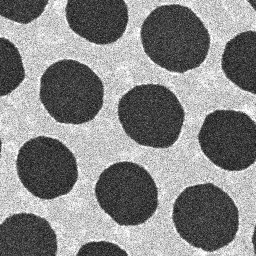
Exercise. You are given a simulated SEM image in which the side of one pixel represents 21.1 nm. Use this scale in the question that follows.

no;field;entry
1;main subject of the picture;holes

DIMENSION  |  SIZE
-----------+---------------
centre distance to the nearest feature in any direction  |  80.9 px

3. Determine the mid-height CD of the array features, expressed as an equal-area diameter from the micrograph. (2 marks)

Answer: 1.39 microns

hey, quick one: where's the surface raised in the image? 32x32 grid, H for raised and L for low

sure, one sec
LLLLLLHHLLLLLLLLHHHHHHHHHHHHHHHL
LLLLLHHHLLLLLLLLHHHLLLLLHHHHHHHH
HLLLHHHHLLLLLLLLHHLLLLLLLHHHHHHH
HHHHHHHHHLLLLLLLHHLLLLLLLLHHHHHH
HHHHHHHHHHLLLLLHHHLLLLLLLLHHHLLL
LLHHHHHHHHHHLLHHHHLLLLLLLLHHLLLL
LLHHHHHHHHHHHHHHHHLLLLLLLLHHLLLL
LLLHHHHHLHHHHHHHHHHLLLLLLLHHLLLL
LLLHHHLLLLLHHHHHHHHHLLLLLHHHLLLL
LLLHHLLLLLLLHHHHHHHHHHHHHHHHLLLL
LLLHHLLLLLLLLHHHHHLHHHHHHHHHHLLL
LHHHHLLLLLLLLHHHLLLLLLHHHHHHHHHL
HHHHHLLLLLLLLHHLLLLLLLHHHHHHHHHH
HHHHHHLLLLLLLHHLLLLLLLLHHHHHHHHH
HHHHHHLLLLLLHHHLLLLLLLLHHHLLLLLH
HHHHHHHHHLHHHHHLLLLLLLLHHLLLLLLL
HHHHHHHHHHHHHHHHLLLLLLLHHLLLLLLL
HHHHLLLHHHHHHHHHHLLLLLHHHLLLLLLL
HHLLLLLLHHHHHHHHHHHLLHHHHLLLLLLL
HHLLLLLLLHHHHHHHHHHHHHHHHHLLLLLL
HHLLLLLLLLHHHHLLLHHHHHHHHHHLLLLL
HHLLLLLLLLHHHLLLLLLHHHHHHHHHHHHH
HHLLLLLLLLHHLLLLLLLHHHHHHHHHHHHH
HHHLLLLLLHHHLLLLLLLLHHHLLLLLHHHH
HHHHLLLLHHHHLLLLLLLLHHLLLLLLLHHH
HHHHHHHHHHHHLLLLLLLLHHLLLLLLLHHH
HHHHHHHHHHHHHLLLLLLHHHLLLLLLLLHH
HLLLLLHHHHHHHHLLLLHHHHLLLLLLLLHH
LLLLLLLHHHHHHHHHHHHHHHLLLLLLLLHH
LLLLLLLHHHHHHHHHHHHHHHLLLLLLLHHH
LLLLLLLHHHHLLLHHHHHHHHHHLLLLLHHH
LLLLLLLHHHLLLLLLHHHHHHHHHHLHHHHH